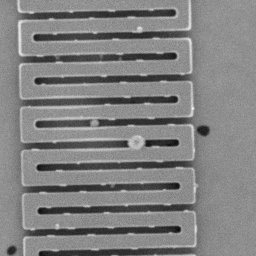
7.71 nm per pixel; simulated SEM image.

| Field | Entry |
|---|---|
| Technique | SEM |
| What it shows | groups of lines, slits or small figures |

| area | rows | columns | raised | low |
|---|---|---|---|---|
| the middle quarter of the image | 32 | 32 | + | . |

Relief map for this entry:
++++++++++++++++++++++++++++++++
++++++++++++++++++++++++++++++++
++++++++++++++++++++++++........
................................
................................
++++++++++++++++++++++++++++++++
++++++++++++++++++++++++++++++++
++++++++++++++++++++++++++++++++
.............................+++
.............................+++
.........+++++++++++++++++++++++
++++++++++++++++++++++++++++++++
++++++++++++++++++++++++++++++++
++++++++++++++++................
.......+........................
.......+...............+++++++++
++++++++++++++++++++++++++++++++
++++++++++++++++++++++++++++++++
++++++++++++++++++++++++++++++++
................++++.........+++
................++++........++++
..........++++++++++++++++++++++
++++++++++++++++++++++++++++++++
++++++++++++++++++++++++++++++++
++++............................
................................
..................++++++++++++++
++++++++++++++++++++++++++++++++
++++++++++++++++++++++++++++++++
+++++++++++++++++++.........++++
.............................+++
............................++++